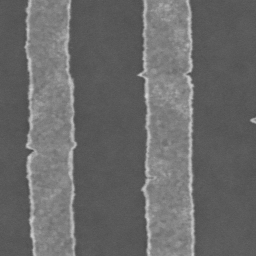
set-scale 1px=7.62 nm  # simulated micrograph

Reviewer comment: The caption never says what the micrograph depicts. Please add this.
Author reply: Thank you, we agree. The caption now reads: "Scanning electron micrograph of one or a few lines or trenches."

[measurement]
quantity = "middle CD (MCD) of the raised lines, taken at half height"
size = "0.328 micrometres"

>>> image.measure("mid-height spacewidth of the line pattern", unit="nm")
576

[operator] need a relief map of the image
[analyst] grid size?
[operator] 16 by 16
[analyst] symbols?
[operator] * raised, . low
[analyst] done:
..**.....***....
..**.....***....
..**.....***....
..**.....***....
..**.....***....
..**.....***....
..***....***....
..***....***....
..***....***....
..**.....***....
..**.....***....
..***....***....
..**.....***....
..**.....***....
..***....***....
..***....***....